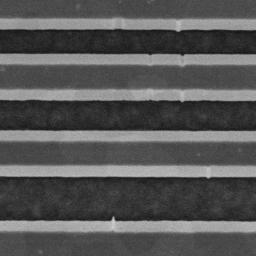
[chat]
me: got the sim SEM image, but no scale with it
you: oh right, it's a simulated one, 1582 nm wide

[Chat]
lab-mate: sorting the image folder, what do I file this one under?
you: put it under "one or a few lines or trenches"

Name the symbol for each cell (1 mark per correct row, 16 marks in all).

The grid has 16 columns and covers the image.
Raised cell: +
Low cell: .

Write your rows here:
++++++++++++++++
++++++++++++++++
................
................
++++++++++++++++
++++++++++++++++
................
................
++++++++.+++.+..
++++++++++++++++
++++++++++++++++
................
................
................
++++++++++++++++
++++++++++++++++